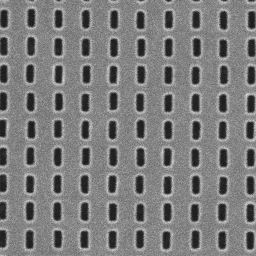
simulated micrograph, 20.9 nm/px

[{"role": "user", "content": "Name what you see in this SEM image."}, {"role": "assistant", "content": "a regular array of holes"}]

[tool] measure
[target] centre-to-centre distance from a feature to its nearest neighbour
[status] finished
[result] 0.563 micrometres